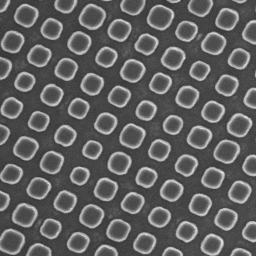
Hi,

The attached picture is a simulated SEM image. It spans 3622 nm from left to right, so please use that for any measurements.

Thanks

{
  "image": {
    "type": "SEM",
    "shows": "a regular array of raised bodies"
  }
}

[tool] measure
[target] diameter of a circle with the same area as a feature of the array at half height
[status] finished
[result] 294 nanometers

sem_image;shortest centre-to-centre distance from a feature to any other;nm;414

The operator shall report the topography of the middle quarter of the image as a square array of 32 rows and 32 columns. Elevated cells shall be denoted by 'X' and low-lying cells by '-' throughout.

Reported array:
XXX-------X----XXXXX-----XXXX---
XXX-----------XXXXXX------------
XX------------XXXXXX---XX-------
XX---XXXX------XXXX---XXXX------
-----XXXXX------------XXXXX-----
----XXXXXX------------XXXX------
-----XXXX---XXXX------XXXX---XXX
-------X---XXXXX------------XXXX
-----------XXXXX------------XXXX
--XXXX-----XXXXX----X-------XXXX
--XXXX-------XX----XXXX-------XX
-XXXXX------------XXXXX---------
-XXXX-----X-------XXXXX---------
---------XXXX------XXX----XXX---
--------XXXXX------------XXXXX--
X-------XXXXX---XX-------XXXXX--
XX------XXXX---XXXXX-----XXXX---
XXX-----------XXXXXX-------X---X
XXX-----------XXXXXX-----------X
XX----XX------XXXXX---XXX------X
-----XXXX-------XXX---XXXX------
-----XXXX------------XXXXX------
-----XXXX---XXX------XXXXX------
-------X----XXXX------XXX----XXX
-----------XXXXXX-----------XXXX
-----------XXXXX------------XXXX
--XXXX------XXXX---XXX------XXXX
--XXXX-------------XXXX-------XX
--XXXX------------XXXXX---------
--XXX----XXX------XXXXX---XX----
--------XXXXX-------XX---XXXX---
--------XXXXX-----------XXXXXX--